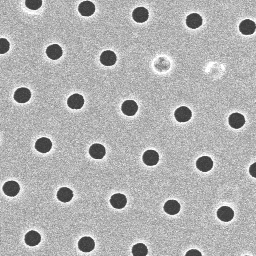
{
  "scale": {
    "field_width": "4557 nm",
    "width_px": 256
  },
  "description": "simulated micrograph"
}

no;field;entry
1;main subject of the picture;a regular array of holes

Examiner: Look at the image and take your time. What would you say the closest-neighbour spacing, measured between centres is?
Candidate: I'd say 0.958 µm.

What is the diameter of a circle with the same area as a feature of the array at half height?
303 nanometers